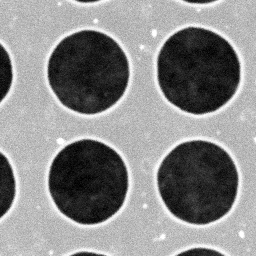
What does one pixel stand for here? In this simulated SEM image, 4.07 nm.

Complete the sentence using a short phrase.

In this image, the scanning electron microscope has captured holes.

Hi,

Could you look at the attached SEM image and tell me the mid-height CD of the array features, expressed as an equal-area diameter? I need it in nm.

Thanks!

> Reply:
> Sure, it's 337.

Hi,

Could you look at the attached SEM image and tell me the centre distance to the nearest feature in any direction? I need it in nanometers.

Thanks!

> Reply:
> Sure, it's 446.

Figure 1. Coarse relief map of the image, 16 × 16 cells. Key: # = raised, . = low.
################
################
####...###....##
.##.....##.....#
.##.....##.....#
.##.....##.....#
####...####...##
################
################
####...####...##
.##.....##.....#
.##.....##.....#
.##.....##.....#
####...####...##
################
################